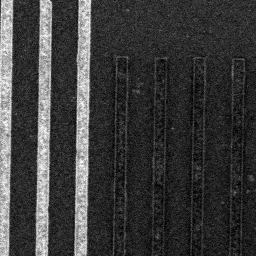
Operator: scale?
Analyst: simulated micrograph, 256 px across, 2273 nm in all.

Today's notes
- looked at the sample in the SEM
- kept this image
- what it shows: parallel lines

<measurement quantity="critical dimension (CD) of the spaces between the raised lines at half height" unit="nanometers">245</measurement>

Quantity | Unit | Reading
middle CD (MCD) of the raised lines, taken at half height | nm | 95.4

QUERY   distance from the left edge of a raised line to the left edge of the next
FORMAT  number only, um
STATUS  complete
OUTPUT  0.344